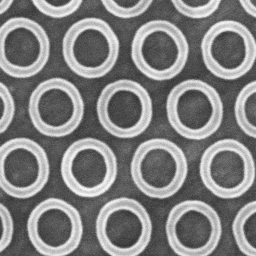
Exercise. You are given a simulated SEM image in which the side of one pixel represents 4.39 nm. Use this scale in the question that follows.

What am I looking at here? a regular array of ring-shaped raised bodies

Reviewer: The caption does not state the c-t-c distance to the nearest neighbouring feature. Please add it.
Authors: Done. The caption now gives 295 nm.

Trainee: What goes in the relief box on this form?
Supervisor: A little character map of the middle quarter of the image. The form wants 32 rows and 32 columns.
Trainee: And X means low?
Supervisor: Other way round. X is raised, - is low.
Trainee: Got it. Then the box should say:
--XX-----XXX------XXX------XXX--
--XXXXXXXXX--------XXXX---XXX---
----XXXXXX----------XXXXXXXX----
----------------------XXXX------
X------------XXXX--------------X
XX---------XXXXXXXX---------XXXX
XXX-------XXX----XXX-------XXX--
-XXX-----XXX------XXX------XX---
--XX-----XX--------XX-----XX----
--XX-----XX---------XX----XX----
---XX----XX---------XX----XX----
---XX----XX---------XX----XX----
--XX-----XX--------XXX----XX----
--XX-----XX--------XXX----XX----
-XXX-----XX--------XX------XX---
XXX-------XXX-----XXX------XXX--
XX---------XXXX-XXXX--------XXXX
X-----------XXXXXX-----------XXX
--------------------------------
---XXXXXX------------XXXXX------
--XXXXXXXXX--------XXXXXXXXX----
-XXX----XXXX------XXX-----XXX---
XXX-------XX------XX-------XXX--
XX--------XXX-----XX--------XX--
XX--------XXX----XX---------XX--
XX---------XX----XX---------XXX-
XX---------XX----XX---------XXX-
XX---------XX----XX---------XX--
XX--------XX-----XX---------XX--
-XX-------XX------XX-------XXX--
-XXX-----XX--------XX-----XXX---
--XXXXXXXX---------XXXXXXXXX----